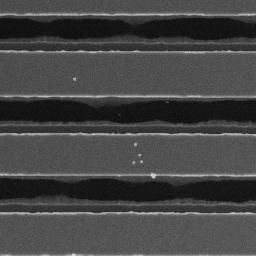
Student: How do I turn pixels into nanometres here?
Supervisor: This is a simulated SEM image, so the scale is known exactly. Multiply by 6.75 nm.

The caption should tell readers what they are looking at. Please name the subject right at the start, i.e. lines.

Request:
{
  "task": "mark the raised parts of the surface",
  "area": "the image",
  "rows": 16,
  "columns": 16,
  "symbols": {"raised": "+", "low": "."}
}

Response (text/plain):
++++++++++++++++
................
................
++++++++++++++++
++++++++++++++++
++++++++++++++++
................
................
++++++++++++++++
++++++++++++++++
++++++++++++++++
................
................
++++++++++++++++
++++++++++++++++
++++++++++++++++